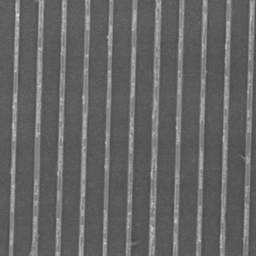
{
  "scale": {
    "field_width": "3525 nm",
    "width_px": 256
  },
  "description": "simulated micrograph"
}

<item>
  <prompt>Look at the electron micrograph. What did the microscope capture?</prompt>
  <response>parallel lines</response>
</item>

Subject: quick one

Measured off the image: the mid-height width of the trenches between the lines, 265 nm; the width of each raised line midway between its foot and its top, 53.3 nm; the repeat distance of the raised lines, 323 nm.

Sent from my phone